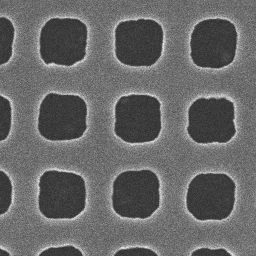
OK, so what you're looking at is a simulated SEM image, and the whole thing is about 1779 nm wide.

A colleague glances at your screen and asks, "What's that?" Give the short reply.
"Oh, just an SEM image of a regular array of holes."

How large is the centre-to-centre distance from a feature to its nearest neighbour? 520 nanometres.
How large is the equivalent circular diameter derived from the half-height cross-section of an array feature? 350 nm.